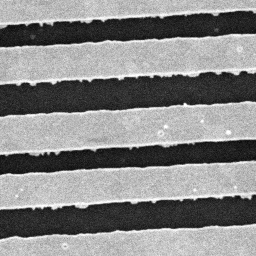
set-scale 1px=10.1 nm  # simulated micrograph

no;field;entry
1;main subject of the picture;lines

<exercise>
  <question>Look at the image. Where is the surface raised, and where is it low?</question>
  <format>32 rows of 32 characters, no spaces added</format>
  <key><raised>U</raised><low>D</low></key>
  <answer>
UUUUUUUUUUUUUUUUUUUUUUUUUUUUUUUU
UUUUUUUUUUUUUUUUUUUUUUUUUUUDDDDD
UUUUUUUUUUDDDDDDDDDDDDDDDDDDDDDD
DDDDDDDDDDDDDDDDDDDDDDDDDDDDDDDD
DDDDDDDDDDDDDDDDDDDDDDDDDDDDUUUU
DDDDDDDDDDUUUUUUUUUUUUUUUUUUUUUU
UUUUUUUUUUUUUUUUUUUUUUUUUUUUUUUU
UUUUUUUUUUUUUUUUUUUUUUUUUUUUUUUU
UUUUUUUUUUUUUUUUUUUUUUUUUUUUUUUU
UUUUUUUUUUUUUUUUUUDDDDDDDDDDDDDD
UDDDDDDDDDDDDDDDDDDDDDDDDDDDDDDD
DDDDDDDDDDDDDDDDDDDDDDDDDDDDDDDD
DDDDDDDDDDDDDDDDDDDDDDDDDDDDDDDD
DDDDDDDDDDDDDDDDDDUUUUUUUUUUUUUU
DUUUUUUUUUUUUUUUUUUUUUUUUUUUUUUU
UUUUUUUUUUUUUUUUUUUUUUUUUUUUUUUU
UUUUUUUUUUUUUUUUUUUUUUUUUUUUUUUU
UUUUUUUUUUUUUUUUUUUUUUUUUUUUUDDD
UUUUUUUUUUUUUDDDDDDDDDDDDDDDDDDD
DDDDDDDDDDDDDDDDDDDDDDDDDDDDDDDD
DDDDDDDDDDDDDDDDDDDDDDDDDUUUUUUU
DDDDDDDUUUUUUUUUUUUUUUUUUUUUUUUU
UUUUUUUUUUUUUUUUUUUUUUUUUUUUUUUU
UUUUUUUUUUUUUUUUUUUUUUUUUUUUUUUU
UUUUUUUUUUUUUUUUUUUUUUUUUUUUDDDD
UUUUUUUUUUUUDDDDDDDDDDDDDDDDDDDD
DDDDDDDDDDDDDDDDDDDDDDDDDDDDDDDD
DDDDDDDDDDDDDDDDDDDDDDDDDDDDDDDD
DDDDDDDDDDDDDDDDDDDDDDDDDUUUUUUU
DDDDDUUUUUUUUUUUUUUUUUUUUUUUUUUU
UUUUUUUUUUUUUUUUUUUUUUUUUUUUUUUU
UUUUUUUUUUUUUUUUUUUUUUUUUUUUUUUU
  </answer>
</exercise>